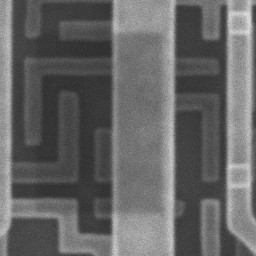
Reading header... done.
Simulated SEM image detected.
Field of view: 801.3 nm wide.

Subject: wiring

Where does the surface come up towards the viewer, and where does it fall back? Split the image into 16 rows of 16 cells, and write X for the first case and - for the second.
X------XXXX---XX
X------XXXX---XX
X------XXXX---XX
X------XXXX---XX
X------XXXX---XX
X------XXXX---XX
X------XXXX---XX
X------XXXX---XX
X------XXXX---XX
X------XXXX---XX
X------XXXX---XX
X------XXXX---XX
X------XXXX---XX
X------XXXX---XX
-------XXXX----X
-------XXXX-----